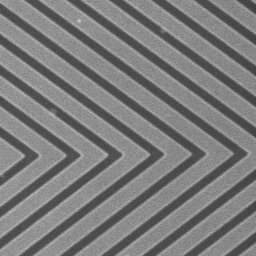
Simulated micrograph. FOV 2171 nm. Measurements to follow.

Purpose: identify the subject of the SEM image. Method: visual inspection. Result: groups of lines, slits or small figures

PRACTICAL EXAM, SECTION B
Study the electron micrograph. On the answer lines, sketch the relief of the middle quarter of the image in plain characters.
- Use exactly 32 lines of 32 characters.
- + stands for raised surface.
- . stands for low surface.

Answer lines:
++....++++++....+++++++....+++++
+++....+++++++....++++++....++++
+++++...+++++++....+++++++....++
++++++....+++++++....++++++....+
.++++++....+++++++....+++++++...
..+++++++....++++++....+++++++..
...+++++++....+++++++....++++++.
+....+++++++...+++++++....++++++
++....+++++++....+++++++...+++++
++++....++++++....+++++++....+++
+++++....+++++++....++++++....++
++++++....+++++++....+++++++....
.+++++++....++++++....+++++++...
...++++++....+++++++....++++++..
....++++++....+++++++....+++++++
+....+++++++....++++++....++++++
+++....++++++....+++++++....++++
++++....+++++++....++++++....+++
+++++....+++++++....+++++++...++
+++++++....++++++....+++++++....
..++++++....+++++++....++++++...
...++++++....+++++++....+++++++.
....+++++++....++++++....+++++++
....++++++....+++++++...+++++++.
...++++++....++++++....+++++++..
.+++++++...+++++++....++++++....
++++++....+++++++...+++++++....+
+++++....++++++....+++++++...+++
++++...+++++++....++++++....++++
++....+++++++....++++++....+++++
+....++++++....+++++++...+++++++
....++++++....++++++....+++++++.